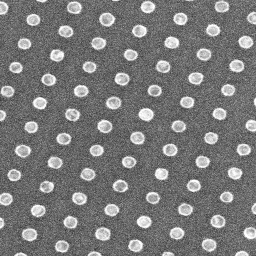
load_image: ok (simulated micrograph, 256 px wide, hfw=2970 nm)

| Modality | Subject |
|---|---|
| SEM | a regular array of raised bodies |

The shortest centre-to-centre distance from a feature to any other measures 294 nm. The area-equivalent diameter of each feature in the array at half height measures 134 nm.